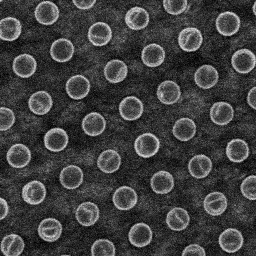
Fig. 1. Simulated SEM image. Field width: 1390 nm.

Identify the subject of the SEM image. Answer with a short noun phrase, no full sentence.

a regular array of raised bodies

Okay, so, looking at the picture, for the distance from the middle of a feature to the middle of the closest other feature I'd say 40.1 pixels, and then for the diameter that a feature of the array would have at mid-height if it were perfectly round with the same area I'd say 125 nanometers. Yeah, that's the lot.